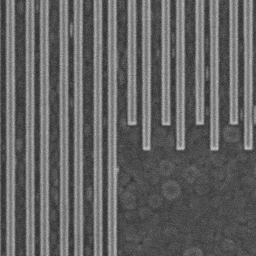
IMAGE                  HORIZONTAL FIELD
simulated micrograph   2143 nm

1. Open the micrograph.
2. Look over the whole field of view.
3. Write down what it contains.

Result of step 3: parallel lines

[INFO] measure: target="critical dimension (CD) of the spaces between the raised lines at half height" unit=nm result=95.7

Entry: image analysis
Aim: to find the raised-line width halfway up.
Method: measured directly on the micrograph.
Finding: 0.0533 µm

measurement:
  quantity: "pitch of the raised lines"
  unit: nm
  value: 142